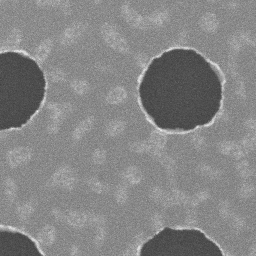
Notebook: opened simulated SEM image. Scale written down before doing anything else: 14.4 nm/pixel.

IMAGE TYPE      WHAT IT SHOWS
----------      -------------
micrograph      holes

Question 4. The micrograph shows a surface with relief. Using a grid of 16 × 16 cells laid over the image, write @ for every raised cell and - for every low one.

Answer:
@@@@@@@@@@@@@@@@
@@@@@@@@@@@@@@@@
@@@@@@@@@@@@@@@@
--@@@@@@@@---@@@
---@@@@@@-----@@
---@@@@@@-----@@
---@@@@@@-----@@
--@@@@@@@@---@@@
@@@@@@@@@@@@@@@@
@@@@@@@@@@@@@@@@
@@@@@@@@@@@@@@@@
@@@@@@@@@@@@@@@@
@@@@@@@@@@@@@@@@
@@@@@@@@@@@@@@@@
-@@@@@@@@@---@@@
--@@@@@@@-----@@